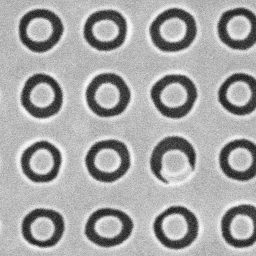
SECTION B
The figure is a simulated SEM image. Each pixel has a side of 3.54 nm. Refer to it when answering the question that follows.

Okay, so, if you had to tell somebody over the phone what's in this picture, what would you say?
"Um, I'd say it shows a regular array of ring-shaped grooves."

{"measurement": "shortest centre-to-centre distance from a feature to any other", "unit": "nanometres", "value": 229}